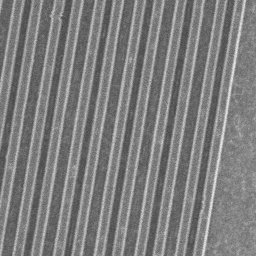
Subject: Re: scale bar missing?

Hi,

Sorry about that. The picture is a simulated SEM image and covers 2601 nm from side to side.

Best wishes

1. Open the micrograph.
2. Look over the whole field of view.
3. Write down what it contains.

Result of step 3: parallel lines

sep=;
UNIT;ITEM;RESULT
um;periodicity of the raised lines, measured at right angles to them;0.202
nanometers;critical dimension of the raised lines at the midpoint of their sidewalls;93.9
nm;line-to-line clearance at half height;93.9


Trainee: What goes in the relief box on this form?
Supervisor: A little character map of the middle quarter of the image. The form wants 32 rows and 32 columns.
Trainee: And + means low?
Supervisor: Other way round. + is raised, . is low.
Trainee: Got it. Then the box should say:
++...+++..++...+++..++...+++..++
++...++...++...++...++...+++..++
++...++..+++...++...++...++...++
+....++..+++...++..+++...++...++
+...+++..++....++..+++...++..+++
+...+++..++....++..++....++..+++
+...+++..++...+++..++....++..++.
+...++...++...++...++...+++..++.
+...++..+++...++...++...++...++.
....++..+++...++..+++...++...++.
....++..++....++..++....++...++.
...+++..++....++..++....++..+++.
...+++..++...+++..++....++..++..
...++...++...+++..++...+++..++..
...++...++...++...++...+++..++..
...++..+++...++..+++...++...++..
...++..++....++..+++...++..+++..
...++..++....++..+++...++..+++..
..+++..++...+++..++....++..++...
..++...++...+++..++...+++..++...
..++...++...++...++...++...++...
..++..+++...++..+++...++...++...
..++..++....++..+++...++...++...
..++..++....++..+++...++..+++...
.+++..++...+++..++....++..++....
.++...++...+++..++...+++..++...+
.++...++...++...++...++...++...+
.++..+++...++..+++...++...++...+
.++..++....++..+++...++...++...+
+++..++....++..+++...++..+++...+
+++..++....++..++....++..++....+
++...++...+++..++...+++..++...++